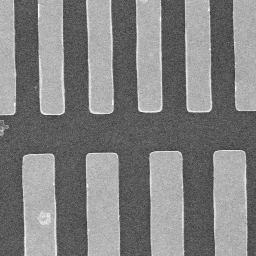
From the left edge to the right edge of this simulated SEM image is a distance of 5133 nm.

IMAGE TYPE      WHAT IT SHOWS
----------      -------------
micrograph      groups of lines, slits or small figures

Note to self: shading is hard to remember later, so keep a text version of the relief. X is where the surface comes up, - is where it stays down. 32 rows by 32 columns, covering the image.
XX---XXX---XXX---XXX---XXX---XXX
XX---XXX---XXX---XXX---XXX---XXX
XX---XXX---XXX---XXX---XXX---XXX
XX---XXX---XXX---XXX---XXX---XXX
XX---XXX---XXX---XXX---XXX---XXX
XX---XXX---XXX---XXX---XXX---XXX
XX---XXX---XXX---XXX---XXX---XXX
XX---XXX---XXX---XXX---XXX---XXX
XX---XXX---XXX---XXX---XXX---XXX
XX---XXX---XXX---XXX---XXX---XXX
XX---XXX---XXX---XXX---XXX---XXX
XX---XXX---XXX---XXX---XXX---XXX
XX---XXX---XXX---XXX---XXX---XXX
XX---XXX---XXX---XXX---XXX----XX
--------------------------------
X-------------------------------
--------------------------------
--------------------------------
--------------------------------
---XXXX----XXXX----XXXX----XXXX-
---XXXX----XXXX----XXXX----XXXX-
---XXXX----XXXX----XXXX----XXXX-
---XXXX----XXXX----XXXX----XXXX-
---XXXX----XXXX----XXXX----XXXX-
---XXXX----XXXX----XXXX----XXXX-
---XXXX----XXXX----XXXX----XXXX-
---XXXX----XXXX----XXXX----XXXX-
---XXXX----XXXX----XXXX----XXXX-
---XXXX----XXXX----XXXX----XXXX-
---XXXX----XXXX----XXXX----XXXX-
---XXXX----XXXX----XXXX----XXXX-
---XXXX----XXXX----XXXX----XXXX-